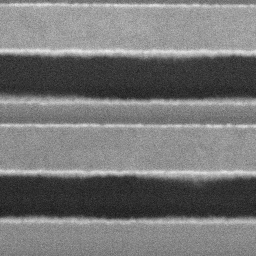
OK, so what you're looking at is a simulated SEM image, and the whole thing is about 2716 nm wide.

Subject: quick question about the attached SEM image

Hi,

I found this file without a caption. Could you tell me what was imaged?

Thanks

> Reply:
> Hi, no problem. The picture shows lines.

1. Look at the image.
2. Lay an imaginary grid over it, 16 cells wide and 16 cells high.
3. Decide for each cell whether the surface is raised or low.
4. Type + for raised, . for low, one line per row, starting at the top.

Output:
++++++++++++++++
++++++++++++++++
++++++++++++++++
................
................
................
++++++++++++++++
++++++++++++++++
++++++++++++++++
++++++++++++++++
++++++++++++++++
................
................
................
++++++++++++++++
++++++++++++++++